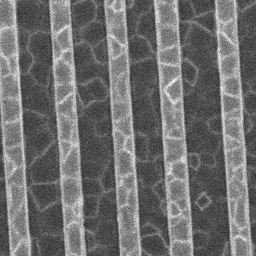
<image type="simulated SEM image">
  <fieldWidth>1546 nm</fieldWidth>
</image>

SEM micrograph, parallel lines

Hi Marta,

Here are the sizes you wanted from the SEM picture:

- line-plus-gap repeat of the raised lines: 0.333 µm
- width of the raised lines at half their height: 114 nm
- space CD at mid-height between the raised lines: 221 nm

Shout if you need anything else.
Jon